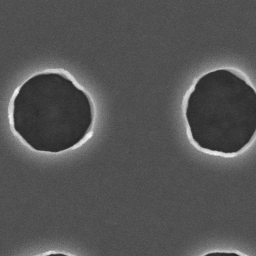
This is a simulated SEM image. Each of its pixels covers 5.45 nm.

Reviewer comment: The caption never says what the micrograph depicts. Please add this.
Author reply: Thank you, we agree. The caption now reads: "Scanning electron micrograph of holes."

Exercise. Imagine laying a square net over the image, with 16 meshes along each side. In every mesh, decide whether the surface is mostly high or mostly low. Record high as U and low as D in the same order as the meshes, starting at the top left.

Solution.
UUUUUUUUUUUUUUUU
UUUUUUUUUUUUUUUU
UUUUUUUUUUUUUUUU
UUUUUUUUUUUUUUUU
UUUUUUUUUUUUUDDU
UDDDDUUUUUUUDDDD
UDDDDDUUUUUUDDDD
UDDDDDUUUUUUDDDD
UDDDDUUUUUUUDDDD
UUUUUUUUUUUUUUUU
UUUUUUUUUUUUUUUU
UUUUUUUUUUUUUUUU
UUUUUUUUUUUUUUUU
UUUUUUUUUUUUUUUU
UUUUUUUUUUUUUUUU
UUUUUUUUUUUUUUUU